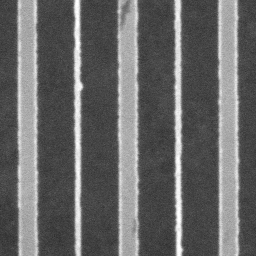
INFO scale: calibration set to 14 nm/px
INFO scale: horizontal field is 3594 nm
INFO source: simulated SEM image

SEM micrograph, lines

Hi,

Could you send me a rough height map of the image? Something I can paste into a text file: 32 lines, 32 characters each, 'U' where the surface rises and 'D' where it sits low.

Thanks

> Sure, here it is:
DDUUDDDDDDDDDDDUUDDDDDDDDDDUUUDD
DDUUDDDDDDDDDDDUUDDDDDDDDDDUUUDD
DDUUDDDDDDDDDDDUUDDDDDDDDDDUUUDD
DDUUDDDDDDDDDDDUUDDDDDDDDDDDUUDD
DDUUDDDDDDDDDDDUUDDDDDDDDDDUUUDD
DDUUDDDDDDDDDDDUUDDDDDDDDDDUUUDD
DDUUDDDDDDDDDDDUUDDDDDDDDDDUUUDD
DDUUDDDDDDDDDDDUUDDDDDDDDDDUUUDD
DDUUDDDDDDDDDDDUUDDDDDDDDDDUUUDD
DDUUDDDDDDDDDDDUUDDDDDDDDDDUUUDD
DDUUUDDDDDDDDDDUUDDDDDDDDDDDUUDD
DDUUDDDDDDDDDDDUUDDDDDDDDDDDUUDD
DDUUDDDDDDDDDDDUUDDDDDDDDDDUUUDD
DDUUUDDDDDDDDDDUUDDDDDDDDDDDUUDD
DDUUDDDDDDDDDDDUUDDDDDDDDDDDUUDD
DDUUDDDDDDDDDDDUUDDDDDDDDDDDUUDD
DDUUUDDDDDDDDDDUUDDDDDDDDDDDUUDD
DDUUDDDDDDDDDDDUUDDDDDDDDDDDUUDD
DDUUDDDDDDDDDDDUUDDDDDDDDDDDUUDD
DDUUUDDDDDDDDDDUUDDDDDDDDDDDUUDD
DDUUUDDDDDDDDDDUUDDDDDDDDDDDUUDD
DDUUUDDDDDDDDDDUUDDDDDDDDDDDUUDD
DDUUUDDDDDDDDDDUUDDDDDDDDDDDUUDD
DDUUDDDDDDDDDDDUUDDDDDDDDDDDUUDD
DDUUUDDDDDDDDDDUUDDDDDDDDDDDUUDD
DDUUUDDDDDDDDDDUUDDDDDDDDDDDUUDD
DDUUUDDDDDDDDDDUUDDDDDDDDDDDUUDD
DDUUDDDDDDDDDDDUUDDDDDDDDDDDUUDD
DDUUUDDDDDDDDDDUUDDDDDDDDDDDUUDD
DDUUUDDDDDDDDDDUUDDDDDDDDDDDUUDD
DDUUUDDDDDDDDDDUUDDDDDDDDDDDUUDD
DDUUUDDDDDDDDDDUUDDDDDDDDDDDUUDD